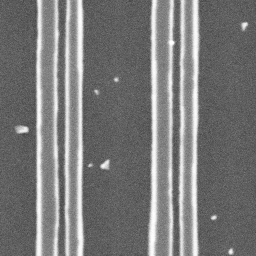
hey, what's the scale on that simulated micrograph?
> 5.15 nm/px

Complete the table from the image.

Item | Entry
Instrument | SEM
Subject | lines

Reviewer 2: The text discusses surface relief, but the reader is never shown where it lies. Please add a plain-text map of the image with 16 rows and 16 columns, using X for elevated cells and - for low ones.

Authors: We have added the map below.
--XXX-----XX----
--XXX-----XX----
--XXX-----XX----
--XXX-----XX----
--XXX-----XX----
--XXX-----XX----
--XXX-----XX----
--XXX-----XX----
--XXX-----XX----
--XXX-----XX----
--XXX-----XX----
--XXX-----XX----
--XXX-----XX----
--XXX-----XX----
--XXX-----XX----
--XXX-----XX----